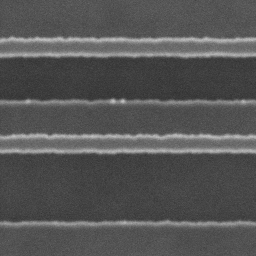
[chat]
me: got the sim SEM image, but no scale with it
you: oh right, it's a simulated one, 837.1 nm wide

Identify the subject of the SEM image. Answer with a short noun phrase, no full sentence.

lines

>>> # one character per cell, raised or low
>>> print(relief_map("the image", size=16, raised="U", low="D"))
UUUUUUUUUUUUUUUU
UUUUUUUUUUUUUUUU
UUUUUUUUUUUUUUUU
UDDDDDDDDDDUDDDD
DDDDDDDDDDDDDDDD
DDDDDDDDDDDDDDDD
UUUUUUUUUUUUUUUU
UUUUUUUUUUUUUUUU
UUUUUUUUUUUUUUUU
UUUUUDUUDUUUUUUU
DDDDDDDDDDDDDDDD
DDDDDDDDDDDDDDDD
DDDDDDDDDDDDDDDD
DDDDDDDDDDDDDDDD
UUUUUUUUUUUUUUUU
UUUUUUUUUUUUUUUU